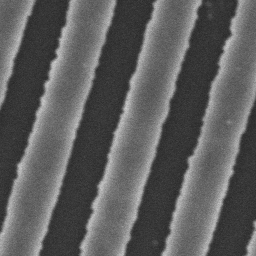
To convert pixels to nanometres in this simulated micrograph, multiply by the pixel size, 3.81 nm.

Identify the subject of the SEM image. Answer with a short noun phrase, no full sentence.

lines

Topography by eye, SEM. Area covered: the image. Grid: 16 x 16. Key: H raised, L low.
HHLLHHHLLLHHLLLH
HHLLHHHLLHHHLLHH
HLLLHHHLLHHHLLHH
HLLHHHLLLHHHLLHH
HLLHHHLLHHHLLLHH
LLLHHHLLHHHLLHHH
LLLHHLLLHHHLLHHH
LLHHHLLHHHLLLHHL
LLHHHLLHHHLLHHHL
LLHHLLLHHHLLHHHL
LHHHLLLHHLLLHHHL
LHHHLLHHHLLHHHLL
LHHHLLHHHLLHHHLL
HHHLLLHHHLLHHHLL
HHHLLHHHLLLHHLLL
HHHLLHHHLLHHHLLH